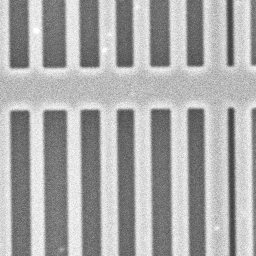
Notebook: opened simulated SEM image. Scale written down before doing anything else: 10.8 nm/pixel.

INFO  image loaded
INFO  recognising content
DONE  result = groups of lines, slits or small figures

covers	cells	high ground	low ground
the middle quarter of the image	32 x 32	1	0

01110000011110000111110000011110
11111111111111111111111111111111
11111111111111111111111111111111
11111111111111111111111111111111
11111111111111111111111111111111
11111111111111111111111111111111
11111111111111111111111111111111
11111111111111111111111111111111
11111111111111111111111111111111
11111111111111111111111111111111
11111111111111111111111111111111
01110000011110000111110000011110
01110000011110000011100000011110
01110000011110000011100000011110
01110000011110000011100000011110
01110000011110000011100000011110
01110000011110000011100000011110
01110000011110000011100000011110
01110000011110000011100000011110
01110000011110000011100000011110
01110000011110000011100000011110
01110000011110000011100000011110
01110000011110000011100000011110
01110000011110000011110000011110
01110000011110000011110000011110
01110000011110000011110000011110
01110000011110000011110000011110
01110000011110000011110000011110
01110000011110000011110000011110
01110000011110000011110000011110
01110000011110000011110000011110
01110000001110000011110000011110